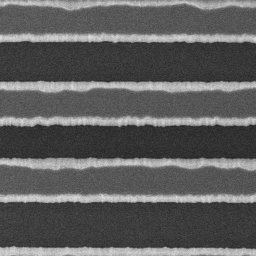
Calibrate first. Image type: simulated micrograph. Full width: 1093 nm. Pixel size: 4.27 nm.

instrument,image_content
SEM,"lines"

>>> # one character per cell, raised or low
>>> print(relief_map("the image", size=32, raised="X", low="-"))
XXXXXXXXXXXXXXXXXXXXXXXXXXXXXXXX
XXXXXXXXXXXXXXXXXXXXXXXXXXXXXXXX
XXXXXXXXXXXXXXXXXXXXXXXXXXXXXXXX
XXXXXXXXXXXXXXXXXXXXXXXXXXXXXXXX
XXXXXXXXXXXXXXXXXXXXXXXXXXXXXXXX
--------------------------------
--------------------------------
--------------------------------
--------------------------------
--------------------------------
XXXXXX-XXXXXXXXXX-XXX--XXXXXXXXX
XXXXXXXXXXXXXXXXXXXXXXXXXXXXXXXX
XXXXXXXXXXXXXXXXXXXXXXXXXXXXXXXX
XXXXXXXXXXXXXXXXXXXXXXXXXXXXXXXX
XXXXXXXXXXXXXXXXXXXXXXXXXXXXXXXX
XXXX-X--X---XXXX-X-XXXXXXXXXXXX-
--------------------------------
--------------------------------
--------------------------------
--------------------------------
XXXXXXXXXXXXXXXXXXXXXXXXXXXXXXXX
XXXXXXXXXXXXXXXXXXXXXXXXXXXXXXXX
XXXXXXXXXXXXXXXXXXXXXXXXXXXXXXXX
XXXXXXXXXXXXXXXXXXXXXXXXXXXXXXXX
XXXXXXXXXXXXXXXXXXXXXXXXXXXXXXXX
--------------------------------
--------------------------------
--------------------------------
--------------------------------
--------------------------------
--------------------------------
XXXXXXXXXXXXXXXXXXXXXXXXXXXXXXXX